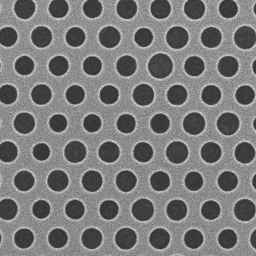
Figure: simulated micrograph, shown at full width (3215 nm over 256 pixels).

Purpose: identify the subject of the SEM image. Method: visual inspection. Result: a regular array of holes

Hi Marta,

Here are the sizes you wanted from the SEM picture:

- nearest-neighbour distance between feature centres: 417 nm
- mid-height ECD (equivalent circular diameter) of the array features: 262 nanometres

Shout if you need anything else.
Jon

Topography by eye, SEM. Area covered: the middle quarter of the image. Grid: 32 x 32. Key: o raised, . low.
.oooo....oooo.....ooo......ooo..
.oooo....oooo.....ooo......ooo..
oooooo...ooooo...oooo.....ooooo.
ooooooooooooooooooooooo..ooooooo
oooooooooooooooooooooooooooooooo
oo..oooooo...ooooo...oooooo...oo
o....oooo.....ooo.....oooo.....o
.....oooo.....ooo......ooo.....o
o....oooo.....ooo.....oooo.....o
o...ooooo....ooooo....oooo....oo
ooooooooooooooooooo..ooooooooooo
oooooooooooooooooooooooooooooooo
oooooo..ooooooooooooooo..oooooo.
.oooo....ooooo....oooo....oooo..
.oooo....oooo.....ooo.....oooo..
.oooo....oooo.....oooo....oooo..
ooooo....ooooo....oooo....oooo..
ooooooooooooooo.ooooooooooooooo.
oooooooooooooooooooooooooooooooo
o...ooooooo.ooooooo.ooooooo..ooo
.....oooo.....oooo....oooo.....o
......ooo.....ooo.....ooo......o
......oo......ooo.....ooo......o
.....oooo....ooooo....oooo.....o
o...oooooo...oooooo..oooooo...oo
oooooooooooooooooooooooooooooooo
oooooooooooooooooooooooooooooooo
.oooo....oooo.....oooo....ooooo.
.oooo.....ooo.....oooo....oooo..
.ooo......ooo.....ooo......ooo..
.oooo....oooo.....oooo....oooo..
ooooo....ooooo...oooooo..oooooo.